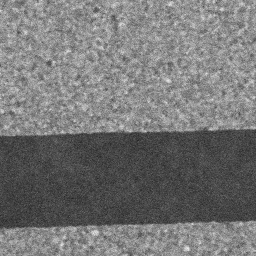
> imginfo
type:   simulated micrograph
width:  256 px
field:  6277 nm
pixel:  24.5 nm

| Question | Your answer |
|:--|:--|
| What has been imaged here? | one or a few lines or trenches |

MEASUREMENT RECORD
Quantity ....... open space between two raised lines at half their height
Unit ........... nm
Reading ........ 2280